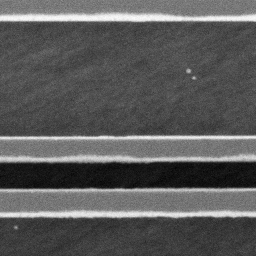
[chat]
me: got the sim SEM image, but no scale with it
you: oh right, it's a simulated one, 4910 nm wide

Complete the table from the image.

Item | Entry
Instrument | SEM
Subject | lines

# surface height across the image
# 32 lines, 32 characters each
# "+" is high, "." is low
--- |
++++++++++++++++++++++++++++++++
++++++++++++++++++++++++++++++++
................................
................................
................................
................................
................................
................................
................................
................................
................................
................................
................................
................................
................................
................................
................................
++++++++++++++++++++++++++++++++
++++++++++++++++++++++++++++++++
++++++++++++++++++++++++++++++++
................................
................................
................................
................................
++++++++++++++++++++++++++++++++
++++++++++++++++++++++++++++++++
++++++++++++++++++++++++++++++++
................................
................................
................................
................................
................................